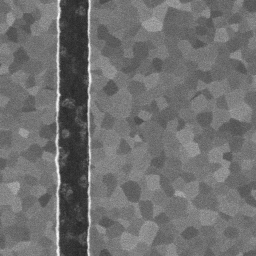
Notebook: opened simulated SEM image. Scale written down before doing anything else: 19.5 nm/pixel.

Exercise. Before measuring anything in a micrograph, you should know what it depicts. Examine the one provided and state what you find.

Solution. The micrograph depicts one or a few lines or trenches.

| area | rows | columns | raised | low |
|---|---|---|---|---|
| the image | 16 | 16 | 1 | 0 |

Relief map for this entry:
1111001111111111
1111001111111111
1111001111111111
1111001111111111
1111001111111111
1111001111111111
1111001111111111
1111001111111111
1111001111111111
1111001111111111
1111001111111111
1111001111111111
1111001111111111
1111001111111111
1111001111111111
1111001111111111